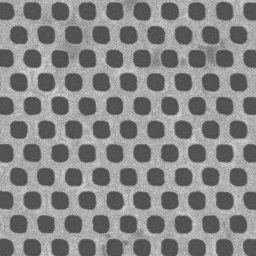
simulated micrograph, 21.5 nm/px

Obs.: a regular array of holes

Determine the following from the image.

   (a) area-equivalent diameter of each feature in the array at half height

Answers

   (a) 407 nanometres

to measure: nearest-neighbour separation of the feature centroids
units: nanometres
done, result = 582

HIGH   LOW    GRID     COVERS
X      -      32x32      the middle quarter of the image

-XXX----XXX---XXXX---XXXX---XXXX
XXXXXXXXXXXXXXXXXXXXXXXXXXXXXXXX
X--XXXXX---XXXX--XXXXX--XXXX---X
-----XX----XXX----XXX----XXX----
-----XX-----XX----XXX----XXX----
-----XX-----XX----XXX----XXX----
X---XXXX---XXXX---XXXX---XXX---X
XXXXXXXXXXXXXXXXXXXXXXXXXXXXXXXX
XXXX---XXXX---XXXX---XXXX---XXXX
-XXX----XX-----XX-----XX----XXX-
-XX-----XX-----XX-----XX-----XX-
-XXX----XXX----XX-----XX-----XX-
-XXX----XXXX--XXXX---XXXX---XXXX
XXXXXXXXXXXXXXXXXXXXXXXXXXXXXXXX
X---XXXX---XXX----XXX---XXXX---X
-----XX----XXX----XXX----XXX----
-----XX-----XX----XXX----XXX----
-----XX-----XX----XXX----XXX----
X---XXXX---XXXX---XXXX--XXXXX---
XXXXXXXXXXXXXXXXXXXXXXXXXXXXXXXX
-XXX---XXXX---XXXX---XXXX---XXXX
-XX-----XX-----XX-----XX-----XX-
-XXX----XX-----XX-----XX-----XX-
-XXX----XXX----XXX----XX-----XX-
XXXXX--XXXXX--XXXXX--XXXX---XXXX
XXXXXXXXXXXXXXXXXXXXXXXXXXXXXXXX
X---XXX----XXX----XXX----XXX----
-----XX----XXX----XXX----XXX----
-----XX-----XX----XXX----XXX----
-----XX-----XX----XXX----XXX----
XX-XXXXXXXXXXXXXXXXXXXX-XXXXXX-X
XXXXXXXXXXXXXXXXXXXXXXXXXXXXXXXX